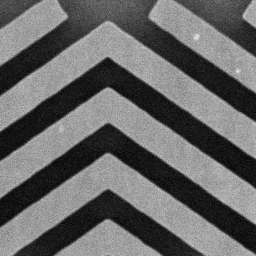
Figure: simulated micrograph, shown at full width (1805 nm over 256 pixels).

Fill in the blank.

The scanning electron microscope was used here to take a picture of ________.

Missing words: groups of lines, slits or small figures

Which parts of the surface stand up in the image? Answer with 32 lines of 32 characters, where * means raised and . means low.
.....**.............**.........*
...*****...........*****.......*
..******...........******......*
*******.....***.....*******.....
*****......*****......******....
****.....*********.....*******..
**......***********......******.
*......******.*******.....******
.....******.....******......****
....******.......******......***
..******..........*******.....**
.******.....**......******......
******.....*****.....*******....
****......*******......******...
***.....***********.....*******.
*......******.******......******
.....*******...*******.....*****
....******.......******......***
...******.........*******.....**
.*******.....*......******.....*
******.....*****.....******.....
*****.....*******......******...
***......*********......******..
**.....*************.....*******
......******...******......*****
....*******.....*******.....****
...******.........******......**
.*******.....*.....*******.....*
******......***......******.....
*****.....*******.....*******...
****.....*********......******..
**.....*************.....******.